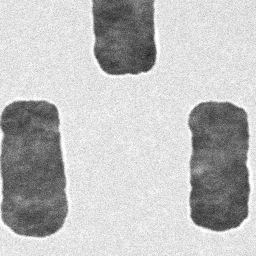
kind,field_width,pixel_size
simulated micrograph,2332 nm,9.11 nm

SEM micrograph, holes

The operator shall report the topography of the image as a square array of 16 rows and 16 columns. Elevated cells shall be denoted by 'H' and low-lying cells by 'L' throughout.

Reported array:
HHHHHHLLLLHHHHHH
HHHHHHLLLLHHHHHH
HHHHHHLLLLHHHHHH
HHHHHHLLLLHHHHHH
HHHHHHHLLHHHHHHH
HHHHHHHHHHHHHHHH
HLLHHHHHHHHHLLLH
LLLLHHHHHHHHLLLH
LLLLHHHHHHHHLLLL
LLLLHHHHHHHHLLLL
LLLLHHHHHHHHLLLL
LLLLHHHHHHHHLLLL
LLLLHHHHHHHHLLLL
LLLLHHHHHHHHLLLH
HLLLHHHHHHHHHHHH
HHHHHHHHHHHHHHHH